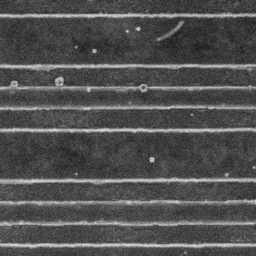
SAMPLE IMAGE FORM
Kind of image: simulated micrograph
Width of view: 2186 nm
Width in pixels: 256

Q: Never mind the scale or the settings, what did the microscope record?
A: lines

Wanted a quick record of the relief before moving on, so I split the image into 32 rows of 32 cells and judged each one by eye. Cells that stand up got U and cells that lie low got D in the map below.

DDDDDDDDDDDDDDDDDDDDDDDDDDDDDDDD
DDDDDDDDDDDDDDDDDDDDDDDDDDDDDDDD
UUUUUUUUUUUUUUUUUUUUUUUUUUUUUUUU
UUUUUUUUUUUUUUUUUUUUUUUUUUUUUUUU
UUUUUUUUUUUUUUUUUUUUUUUUUUUUUUUU
UUUUUUUUUUUUUUUUUUUUUUUUUUUUUUUU
UUUUUUUUUUUUUUUUUUUUUUUUUUUUUUUU
UUUUUUUUUUUUUUUUUUUUUUUUUUUUUUUU
DDDDDDDDDDDDDDDDDDDDDDDDDDDDDDDD
DDDDDDDDDDDDDDDDDDDDDDDDDDDDDDDD
DDDDDDDUDDDDDDDDDDDDDDDDDDDDDDDD
UUUUUUUUUUUUUUUUUUUUUUUUUUUUUUUU
UUUUUUUUUUUUUUUUUUUUUUUUUUUUUUUU
DUUUUDDDDDUDDDDDDDDDDDDDDDDDDDDD
DDDDDDDDDDDDDDDDDDDDDDDDDDDDDDDD
DDDDDDDDDDDDDDDDDDDDDDDDDDDDDDDD
UUUUUUUUUUUUUUUUUUUUUUUUUUUUUUUU
UUUUUUUUUUUUUUUUUUUUUUUUUUUUUUUU
UUUUUUUUUUUUUUUUUUUUUUUUUUUUUUUU
UUUUUUUUUUUUUUUUUUUUUUUUUUUUUUUU
UUUUUUUUUUUUUUUUUUUUUUUUUUUUUUUU
UUUUUUUUUUUUUUUUUUUUUUUUUUUUUUUU
UUUUUUUUDUUUUUUUDDDDDDDDDDDDDDDD
DDDDDDDDDDDDDDDDDDDDDDDDDDDDDDDD
DDDDDDDDDDDDDDDDDDDDDDDDDDDDDDDD
UUUUUUUUUUUUUUUUUUUUUUUUUUUUUUUU
UUUUUUUUUUUUUUUUUUUUUUUUUUUUUUUU
UUUUUUUUUUUUUUUUUUUUUUUUUUUUUUUU
DDDDDDDDDDDDDDDDDDDDDDDDDDDDDDDD
DDDDDDDDDDDDDDDDDDDDDDDDDDDDDDDD
DDDDDDDDDDDDDDDDDDDDDDDDDDDDDDDD
UUUUUUUUUUUUUUUUUUUUUUUUUUUUUUUU